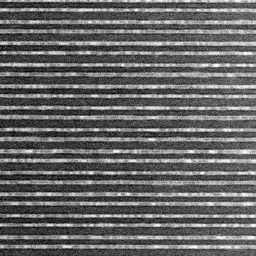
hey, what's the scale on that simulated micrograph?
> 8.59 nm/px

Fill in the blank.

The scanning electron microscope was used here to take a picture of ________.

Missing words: parallel lines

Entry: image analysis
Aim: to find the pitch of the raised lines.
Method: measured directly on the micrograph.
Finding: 92.5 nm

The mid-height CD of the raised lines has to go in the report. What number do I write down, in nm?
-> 24.7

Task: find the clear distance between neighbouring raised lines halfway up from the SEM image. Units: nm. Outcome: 59.1